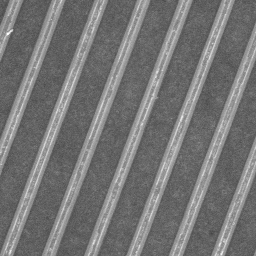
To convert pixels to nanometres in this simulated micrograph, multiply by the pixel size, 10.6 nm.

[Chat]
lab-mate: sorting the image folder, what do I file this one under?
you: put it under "parallel lines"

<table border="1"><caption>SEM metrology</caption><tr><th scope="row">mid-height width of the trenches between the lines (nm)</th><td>336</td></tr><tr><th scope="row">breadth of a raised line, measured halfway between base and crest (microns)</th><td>0.0869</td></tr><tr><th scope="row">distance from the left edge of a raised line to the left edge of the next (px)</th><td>39.7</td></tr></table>